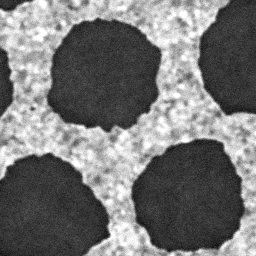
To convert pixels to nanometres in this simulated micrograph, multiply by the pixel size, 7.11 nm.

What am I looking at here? holes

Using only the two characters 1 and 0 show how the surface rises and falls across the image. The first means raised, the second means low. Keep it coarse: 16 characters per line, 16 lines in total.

0111111111111100
1111100011111000
1111000001110000
0110000000110000
0110000000110000
0110000000111000
0110000000111000
1111000001111111
1111111111111111
1111111111000011
0000011110000001
0000011100000001
0000001100000001
0000000100000001
0000000110000001
0000001111000011